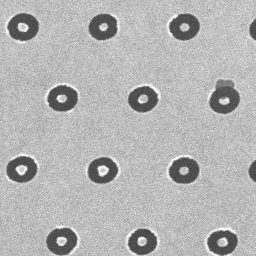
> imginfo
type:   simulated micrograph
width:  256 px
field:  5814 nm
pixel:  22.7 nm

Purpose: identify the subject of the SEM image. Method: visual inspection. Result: a regular array of ring-shaped grooves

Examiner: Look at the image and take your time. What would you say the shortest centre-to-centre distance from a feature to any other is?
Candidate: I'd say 80.8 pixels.